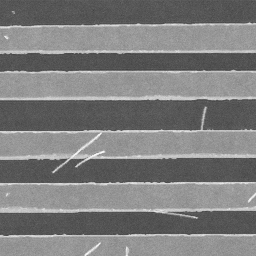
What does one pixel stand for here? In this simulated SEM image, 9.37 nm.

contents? lines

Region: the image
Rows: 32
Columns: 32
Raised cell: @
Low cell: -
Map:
--------------------------------
--------------------------------
--------------------------------
@@@@@@@@@@@@@@@@@@@@@@@@@@@@@@@@
@@@@@@@@@@@@@@@@@@@@@@@@@@@@@@@@
@@@@@@@@@@@@@@@@@@@@@@@@@@@@@@@@
@@@@@@@@@@@@@@@@@@@@@@@@@@-@@@@-
--------------------------------
--------------------------------
@@@@@@@@@@@@@@@@@@@@@@@@@@@@@@@@
@@@@@@@@@@@@@@@@@@@@@@@@@@@@@@@@
@@@@@@@@@@@@@@@@@@@@@@@@@@@@@@@@
--------------------------------
--------------------------------
--------------------------------
--------------------------------
@@@@@@@@@@@@@@@@@@@@@@@@@@@@@@@@
@@@@@@@@@@@@@@@@@@@@@@@@@@@@@@@@
@@@@@@@@@@@@@@@@@@@@@@@@@@@@@@@@
@@@@@@@@@@@@@@@@@@@@@@@@@@@@@@@@
--------------------------------
--------------------------------
--------------------------------
@@@@@@@@@@@@@@@@@@@@@@@@@@@@@@@@
@@@@@@@@@@@@@@@@@@@@@@@@@@@@@@@@
@@@@@@@@@@@@@@@@@@@@@@@@@@@@@@@@
-------------------@@-----------
--------------------------------
--------------------------------
@@@@@@@@@@@@@@@@@@@@@@@@@@@@@@@@
@@@@@@@@@@@@@@@@@@@@@@@@@@@@@@@@
@@@@@@@@@@@@@@@@@@@@@@@@@@@@@@@@